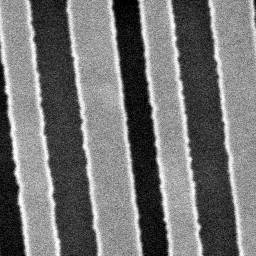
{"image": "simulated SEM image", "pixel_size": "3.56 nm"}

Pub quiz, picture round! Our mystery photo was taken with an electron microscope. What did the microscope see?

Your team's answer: lines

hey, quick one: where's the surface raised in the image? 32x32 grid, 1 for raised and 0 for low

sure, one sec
11110000111111000111100000111111
11110000111111000011100000111111
11110000011111000011110000011111
11110000011111000011110000011111
11110000011111000011110000011111
11110000011111100011110000011111
11110000011111100011110000011111
11110000011111100011110000011111
01111000011111100011110000011111
01111000001111100011110000011111
01111000001111100001111000011111
01111000001111100001111000001111
01111000001111100001111000001111
01111000001111100001111000001111
01111000001111110001111000001111
01111000001111110001111000001111
01111000001111110001111000001111
00111100000111110000111000001111
00111100000111110000111100001111
00111100000111110000111100000111
00111100000111110000111100000111
00111100000111110000111100000111
00111100000111111000111100000111
00011100000111111000111100000111
00111100000111111000111100000111
00111110000011111000111100000111
00011110000011111000011110000111
00011110000011111000011110000011
00011110000011111000011110000011
00011110000011111000011110000011
00011110000011111000011110000011
00011110000011111100011110000011